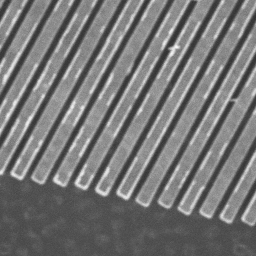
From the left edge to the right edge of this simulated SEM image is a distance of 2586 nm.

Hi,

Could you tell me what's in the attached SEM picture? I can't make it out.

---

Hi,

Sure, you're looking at parallel lines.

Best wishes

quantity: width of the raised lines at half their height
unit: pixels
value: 12.9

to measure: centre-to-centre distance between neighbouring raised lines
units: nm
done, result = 205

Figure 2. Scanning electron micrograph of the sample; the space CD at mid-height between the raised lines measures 70.8 nm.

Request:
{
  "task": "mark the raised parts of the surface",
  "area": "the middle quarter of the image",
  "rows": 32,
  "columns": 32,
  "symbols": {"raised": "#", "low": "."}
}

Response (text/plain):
..###..####..####..###...###...#
.###...###..#####.####..####..##
####..####..####..###...###..###
###...###..####..####..####..###
###..####..####..###...###..####
##..####..####..####..####..###.
##..####..###...###...###..####.
#..####..####..####..###...###..
#..###...###..####..####..####..
..####..####..####..###...###..#
..###..####..####..####..####..#
.####..####..###...###..####..##
.###..####..####..####..####..##
####..####..###...###..####..###
###..####..####..####..###...###
###..####..###...###..####..####
##..####..####..####..###...###.
#...###...###...###..####..###..
#..####..####..###...###...###..
..####..####..####..####..####..
..####..###...###...###...###..#
.####..####..####..####..####..#
.####..###...###..####..####..##
####..####..####..###...###...##
####..###...###..####..####..###
###..####..####..###...###..####
##...###...###..####..####..###.
##..####..####..###...###..####.
#...###..####..####..####..###..
#..####..###...###...###..####..
....##..####..####..####..###...
........###...###..####..####..#